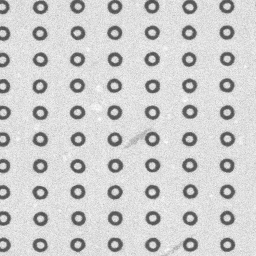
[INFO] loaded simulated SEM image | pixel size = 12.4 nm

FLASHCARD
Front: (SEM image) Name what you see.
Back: a regular array of ring-shaped grooves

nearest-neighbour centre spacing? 327 nanometres